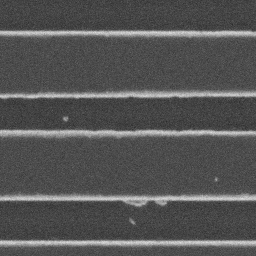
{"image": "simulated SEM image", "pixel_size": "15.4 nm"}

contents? lines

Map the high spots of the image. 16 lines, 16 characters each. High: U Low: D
DDDDDDDDDDDDDDDD
DDDDDDDDDDDDDDDD
UUUUUUUUUUUUUUUU
UUUUUUUUUUUUUUUU
UUUUUUUUUUUUUUUU
UUUUUUUUUUUUUUUU
DDDDDDDDDDDDDDDD
DDDDDDDDDDDDDDDD
UUUUUUUUUUUUUUUU
UUUUUUUUUUUUUUUU
UUUUUUUUUUUUUUUU
UUUUUUUUUUUUUUUU
DDDDDDDDDDDDDDDD
DDDDDDDDDDDDDDDD
DDDDDDDDDDDDDDDD
UUUUUUUUUUUUUUUU